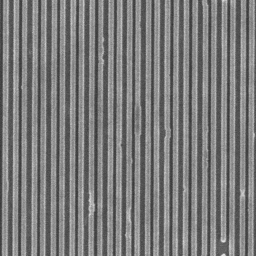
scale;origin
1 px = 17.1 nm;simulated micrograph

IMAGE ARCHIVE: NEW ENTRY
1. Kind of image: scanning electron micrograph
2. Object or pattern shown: parallel lines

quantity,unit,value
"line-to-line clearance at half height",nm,89.7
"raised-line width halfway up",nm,76.9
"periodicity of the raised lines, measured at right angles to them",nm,162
